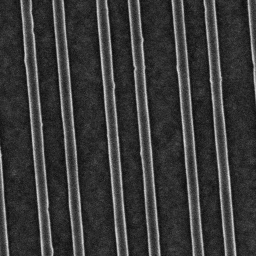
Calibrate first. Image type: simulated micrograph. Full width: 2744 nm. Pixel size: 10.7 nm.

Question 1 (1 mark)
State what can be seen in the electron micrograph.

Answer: parallel lines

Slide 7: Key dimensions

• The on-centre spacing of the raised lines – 392 nanometres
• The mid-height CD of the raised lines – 0.11 µm